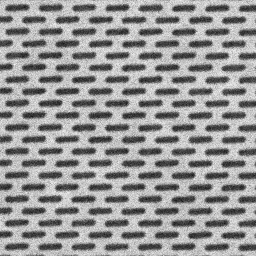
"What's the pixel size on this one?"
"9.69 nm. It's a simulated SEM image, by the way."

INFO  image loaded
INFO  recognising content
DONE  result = a regular array of holes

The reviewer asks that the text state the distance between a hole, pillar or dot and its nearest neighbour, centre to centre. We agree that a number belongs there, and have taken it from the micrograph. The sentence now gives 194 nanometers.